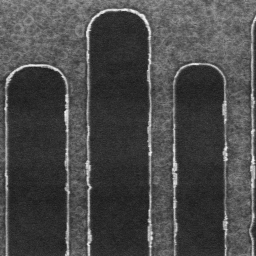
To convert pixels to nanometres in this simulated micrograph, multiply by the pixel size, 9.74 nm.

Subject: one or a few lines or trenches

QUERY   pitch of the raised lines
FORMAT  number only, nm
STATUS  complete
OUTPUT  793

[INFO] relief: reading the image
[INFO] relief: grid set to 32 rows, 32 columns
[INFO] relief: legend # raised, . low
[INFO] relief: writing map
................................
.............####...............
............######..............
...........########.............
...........########.............
...........########.............
...........########.............
...........########.............
..#####....########....####.....
.#######...########...######....
.#######...########...######....
.#######...########...######...#
.#######...########...######...#
.#######...########...######...#
.#######...########...######....
.#######...########...######....
.#######...########...######...#
.#######...########...######....
.#######...########...######....
.#######...########...######....
.#######...########...######...#
.#######...########...######...#
.########..########...######...#
.########..########...######...#
.########..########...######....
.########..########...######....
.########..########...######....
.#######...########...######...#
.########..########...######...#
.#######...########...######...#
.########..########...######...#
.########..########...######....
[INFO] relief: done